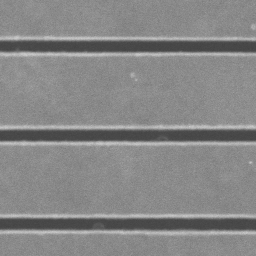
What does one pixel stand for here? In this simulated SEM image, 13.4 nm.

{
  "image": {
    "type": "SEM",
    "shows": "lines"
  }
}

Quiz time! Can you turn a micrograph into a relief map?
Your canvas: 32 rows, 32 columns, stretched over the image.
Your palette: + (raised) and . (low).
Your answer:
++++++++++++++++++++++++++++++++
++++++++++++++++++++++++++++++++
++++++++++++++++++++++++++++++++
++++++++++++++++++++++++++++++++
++++++++++++++++++++++++++++++++
................................
................................
++++++++++++++++++++++++++++++++
++++++++++++++++++++++++++++++++
++++++++++++++++++++++++++++++++
++++++++++++++++++++++++++++++++
++++++++++++++++++++++++++++++++
++++++++++++++++++++++++++++++++
++++++++++++++++++++++++++++++++
++++++++++++++++++++++++++++++++
++++++++++++++++++++++++++++++++
................................
................................
++++++++++++++++++++++++++++++++
++++++++++++++++++++++++++++++++
++++++++++++++++++++++++++++++++
++++++++++++++++++++++++++++++++
++++++++++++++++++++++++++++++++
++++++++++++++++++++++++++++++++
++++++++++++++++++++++++++++++++
++++++++++++++++++++++++++++++++
++++++++++++++++++++++++++++++++
................................
................................
++++++++++++++++++++++++++++++++
++++++++++++++++++++++++++++++++
++++++++++++++++++++++++++++++++